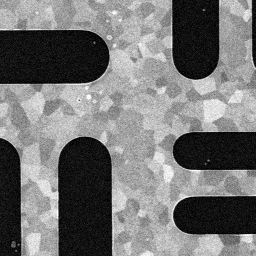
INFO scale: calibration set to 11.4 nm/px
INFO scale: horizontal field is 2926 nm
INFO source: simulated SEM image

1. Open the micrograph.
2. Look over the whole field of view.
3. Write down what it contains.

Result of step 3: groups of lines, slits or small figures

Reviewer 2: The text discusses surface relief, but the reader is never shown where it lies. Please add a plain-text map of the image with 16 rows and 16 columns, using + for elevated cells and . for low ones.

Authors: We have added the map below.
+++++++++++...++
+++++++++++...++
......+++++...++
.......++++...++
.......++++..+++
++++++++++++++++
++++++++++++++++
++++++++++++++++
+++++++++++.....
.+++...++++.....
.+++...+++++....
.+++...+++++++++
.+++...++++.....
.+++...++++.....
.+++...+++++....
.+++...+++++++++